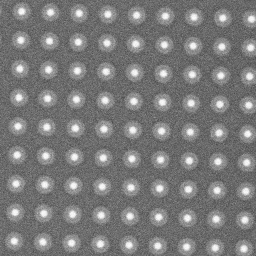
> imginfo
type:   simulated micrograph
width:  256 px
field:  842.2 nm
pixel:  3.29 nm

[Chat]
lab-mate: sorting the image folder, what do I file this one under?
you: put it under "an array of small figures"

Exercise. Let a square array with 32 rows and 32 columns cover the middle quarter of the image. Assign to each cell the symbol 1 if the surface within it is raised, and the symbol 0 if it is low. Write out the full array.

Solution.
01111000011100001110000011000000
01111000111110001111000111100011
01111000111110001111000111100011
00110000011100001110000111100011
00000000000000000000000001000001
00000000000000000000000000000000
00000000000000000000000000000000
01111000011100001100000010000000
01111000111100011110000111000011
01111000111100011111000111100011
00111000011100001110000111100011
00000000000000000000000011000011
00000000000000000000000000000000
00000000000000000000000000000000
01110000011000000100000000000000
01111000111100011110000111000011
01111000111100011110001111100011
01111000111100011110001111000011
00000000000000001100000111000011
00000000000000000000000000000000
00000000000000000000000000000000
01110000011000000000000000000000
01111000111100011110000111000011
11111000111100011110001111000111
01110000111100011110001111000111
00000000011000001100000111000011
00000000000000000000000000000000
00000000000000000000000000000000
01100000000000000000000000000000
01110000111000011100000110000011
11110001111100011110001111000111
11110000111100011110001111000111